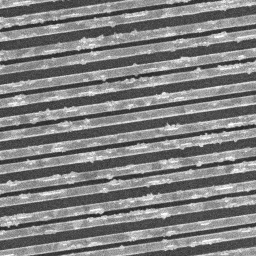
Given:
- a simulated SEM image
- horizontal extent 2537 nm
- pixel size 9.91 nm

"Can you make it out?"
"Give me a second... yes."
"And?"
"parallel lines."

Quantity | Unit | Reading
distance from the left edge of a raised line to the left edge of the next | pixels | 16.3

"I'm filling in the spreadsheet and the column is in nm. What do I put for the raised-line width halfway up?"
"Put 83.4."